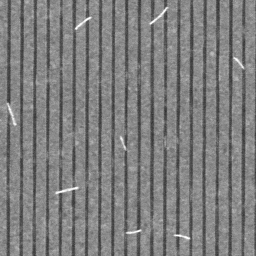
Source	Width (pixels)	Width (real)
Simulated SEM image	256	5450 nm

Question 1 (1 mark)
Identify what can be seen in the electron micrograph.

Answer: parallel lines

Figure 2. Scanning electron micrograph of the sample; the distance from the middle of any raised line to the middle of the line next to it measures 13 px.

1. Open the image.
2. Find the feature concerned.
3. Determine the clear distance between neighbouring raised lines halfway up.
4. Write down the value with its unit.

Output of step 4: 79.8 nm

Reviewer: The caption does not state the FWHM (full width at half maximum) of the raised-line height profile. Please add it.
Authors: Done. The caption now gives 197 nanometers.